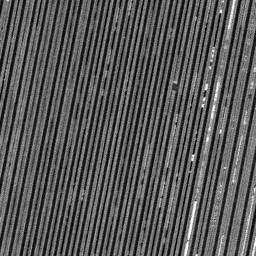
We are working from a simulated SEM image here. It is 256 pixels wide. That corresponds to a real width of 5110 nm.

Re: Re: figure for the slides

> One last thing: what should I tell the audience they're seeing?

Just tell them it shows parallel lines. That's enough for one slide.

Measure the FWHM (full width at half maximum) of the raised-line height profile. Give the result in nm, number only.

56.3